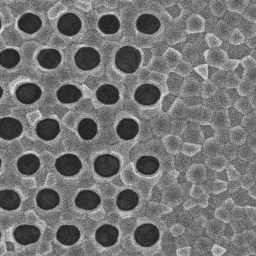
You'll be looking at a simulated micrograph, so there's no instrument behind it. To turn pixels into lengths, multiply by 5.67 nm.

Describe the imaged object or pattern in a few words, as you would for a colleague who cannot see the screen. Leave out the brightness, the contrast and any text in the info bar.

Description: a regular array of holes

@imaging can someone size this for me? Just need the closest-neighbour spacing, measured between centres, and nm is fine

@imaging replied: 224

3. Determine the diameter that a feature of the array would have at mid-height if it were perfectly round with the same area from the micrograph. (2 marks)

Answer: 22.9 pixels